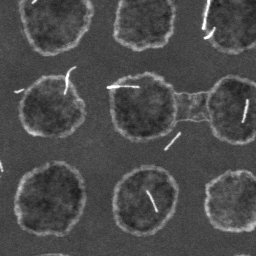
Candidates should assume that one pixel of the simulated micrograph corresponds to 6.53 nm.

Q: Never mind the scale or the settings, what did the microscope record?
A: raised bodies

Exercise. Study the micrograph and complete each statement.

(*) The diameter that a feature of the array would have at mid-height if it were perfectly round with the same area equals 427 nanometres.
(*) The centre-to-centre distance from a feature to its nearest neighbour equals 0.599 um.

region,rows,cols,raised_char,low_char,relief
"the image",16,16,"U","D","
DUUUUUDUUUUDDUUU
DDUUUDDUUUUDDUUU
DDUUUDDDUUDDDUUU
DDDDDDDDDDDDDDDD
DDDDDDDDDDDDDDDD
DDUUUDDUUUUDDUUU
DUUUUDDUUUUDDUUU
DUUUUDDUUUUDDUUU
DDDDDDDDUUDDDDUU
DDDDDDDDDDDDDDDD
DDDUDDDDDDDDDDDD
DUUUUDDUUUUDDUUU
DUUUUDDUUUUDDUUU
DUUUUDDUUUUDDUUU
DDUUDDDDUDDDDDDD
DDDDDDDDDDDDDDDD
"